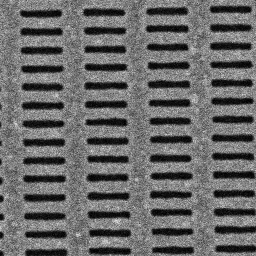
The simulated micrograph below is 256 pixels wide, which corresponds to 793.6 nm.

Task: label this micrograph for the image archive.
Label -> a regular array of holes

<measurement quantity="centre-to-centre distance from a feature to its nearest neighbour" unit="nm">56.7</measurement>